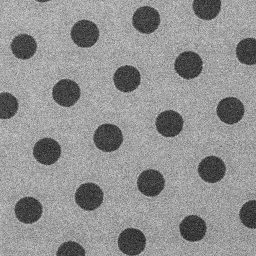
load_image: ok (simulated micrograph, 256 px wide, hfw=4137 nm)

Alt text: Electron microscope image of a regular array of holes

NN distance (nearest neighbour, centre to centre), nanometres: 997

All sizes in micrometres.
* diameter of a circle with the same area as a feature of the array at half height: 0.463